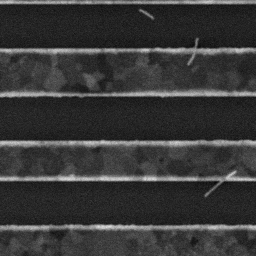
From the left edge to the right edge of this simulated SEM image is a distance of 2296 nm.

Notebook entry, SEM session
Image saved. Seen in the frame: lines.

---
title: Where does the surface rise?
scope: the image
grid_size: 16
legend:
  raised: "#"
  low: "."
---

................
................
................
################
################
################
................
................
................
################
################
................
................
................
################
################